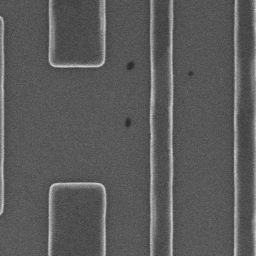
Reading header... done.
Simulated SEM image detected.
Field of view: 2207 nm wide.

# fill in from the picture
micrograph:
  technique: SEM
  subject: wiring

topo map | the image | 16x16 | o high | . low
...oooo..oo....o
...oooo..oo....o
...oooo..oo....o
...oooo..oo....o
.........oo....o
.........oo....o
.........oo....o
.........oo....o
.........oo....o
.........oo....o
.........oo....o
....oo...oo....o
...oooo..oo....o
...oooo..oo....o
...oooo..oo....o
...oooo..oo....o